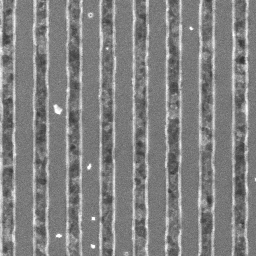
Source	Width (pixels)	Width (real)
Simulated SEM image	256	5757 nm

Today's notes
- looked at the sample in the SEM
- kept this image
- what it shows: wiring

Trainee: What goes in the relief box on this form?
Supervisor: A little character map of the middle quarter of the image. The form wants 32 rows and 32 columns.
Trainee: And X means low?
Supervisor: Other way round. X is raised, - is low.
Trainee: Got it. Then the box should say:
-XXX-----XXXX-----XXX-----XXX---
-XXX-----XXXX-----XXX-----XXX---
-XXX-----XXX------XXX-----XXX---
-XXX-----XXX------XXX-----XXX---
-XXX-----XXX------XXX-----XXX---
-XXX-----XXX------XXX-----XXX---
-XXX-----XXX------XXX-----XXX---
-XXX-----XXX------XXX-----XXX---
-XXX-----XXX------XXX-----XXX---
-XXX-----XXX------XXX-----XXX---
-XXX-----XXX------XXX-----XXX---
-XXX-----XXX------XXX-----XXX---
-XXX-----XXX------XXX-----XXX---
-XXX-----XXX------XXX-----XXX---
-XXX-----XXX------XXX-----XXX---
-XXX-----XXX------XXX-----XXX---
-XXX-----XXX------XXX-----XXX---
-XXX-----XXX------XXX-----XXX---
-XXX-----XXX------XXX-----XXX---
-XXX-----XXX------XXX-----XXX---
-XXX-----XXX------XXX-----XXX---
-XXX-----XXX------XXX-----XXX---
-XXX-----XXX------XXX-----XXX---
-XXX-----XXX------XX------XXX---
-XXX-----XXX------XX------XXX---
-XXX-----XXX------XXX-----XXX---
-XXX-----XXX------XXX-----XXX---
-XXX-----XXX------XXX-----XXX---
-XXX-----XXX------XXX-----XXX---
-XXX-----XXX------XX------XXX---
-XXX-----XXX------XX------XXX---
-XXX-----XXX------XX------XXX---